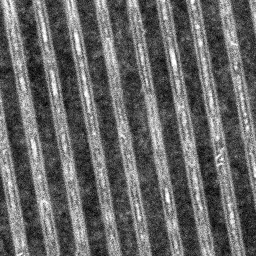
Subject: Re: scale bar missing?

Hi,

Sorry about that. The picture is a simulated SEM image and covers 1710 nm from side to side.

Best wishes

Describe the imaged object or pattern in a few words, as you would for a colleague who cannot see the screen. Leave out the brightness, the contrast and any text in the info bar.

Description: parallel lines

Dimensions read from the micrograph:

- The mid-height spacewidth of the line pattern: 62.4 nm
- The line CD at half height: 0.136 micrometres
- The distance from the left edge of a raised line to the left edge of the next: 203 nanometers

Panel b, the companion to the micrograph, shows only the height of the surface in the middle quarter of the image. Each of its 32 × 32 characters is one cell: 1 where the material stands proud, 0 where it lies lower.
11100011111001111110011111000111
11100011111001111110011111000111
11110011111000111110011111100111
11110011111000111110001111100011
11110011111000111111001111100011
11110001111100111111001111100011
11110001111100111111001111100011
11110001111100111111001111110011
11110001111100111111000111110011
11111001111100011111100111110001
11111000111110011111100111110001
11111000111110011111100111110001
11111000111110011111100111110001
11111100111110011111100011111001
11111100111110001111100011111001
01111100111110001111100011111000
01111100011111001111110011111000
01111100011111001111110011111000
01111100011111001111110011111100
01111110011111000111110001111100
00111110011111000111110001111100
00111110011111100111111001111100
00111110001111100111111001111100
00111110001111100111111001111100
00111111001111100011111000111110
00111111001111100011111000111110
00111111001111100011111000111110
00011111000111110011111100111110
00011111000111110011111100111110
00011111000111110011111100111110
10011111100111110011111100011111
10011111100111110001111100011111